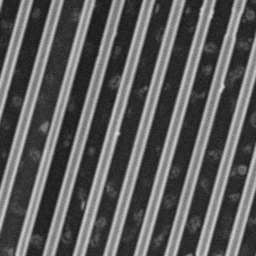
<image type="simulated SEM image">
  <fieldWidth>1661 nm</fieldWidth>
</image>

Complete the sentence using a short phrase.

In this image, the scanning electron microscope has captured parallel lines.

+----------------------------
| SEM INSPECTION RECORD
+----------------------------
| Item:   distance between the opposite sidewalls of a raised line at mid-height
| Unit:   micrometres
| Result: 0.0688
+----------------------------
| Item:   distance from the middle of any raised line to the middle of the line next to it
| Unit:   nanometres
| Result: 190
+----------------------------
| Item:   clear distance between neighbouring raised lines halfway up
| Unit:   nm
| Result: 121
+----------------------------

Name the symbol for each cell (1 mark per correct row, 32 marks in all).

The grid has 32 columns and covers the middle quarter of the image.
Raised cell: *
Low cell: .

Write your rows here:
.**.....***....***.....***.....*
.**.....**.....***.....**.....**
***....***.....***....***.....**
**.....***.....**.....***.....**
**.....**.....***.....***.....**
**.....**.....***.....**.....***
**....***.....**.....***.....***
*.....***.....**.....***.....**.
*.....**.....***.....***....***.
*....***.....***.....**.....***.
*....***.....**.....***.....***.
.....***....***.....***.....**..
.....**.....***.....**.....***..
....***.....**.....***.....***..
....***.....**.....***.....**...
....**.....***.....***....***...
...***.....***.....**.....***...
...***.....**.....***.....***...
...***.....**.....***.....**....
...**.....***.....***....***....
..***.....***.....**.....***....
..***.....**.....***.....***....
..***....***.....***.....**.....
..**.....***.....**.....***.....
.***.....**.....***.....***.....
.***.....**.....***.....**.....*
.**.....***.....***....***.....*
***.....***.....**.....***.....*
***.....**.....***.....***.....*
***.....**.....***.....**.....**
**.....***.....***....***.....**
**.....***.....**.....***.....**